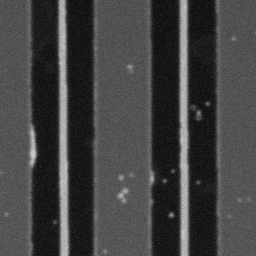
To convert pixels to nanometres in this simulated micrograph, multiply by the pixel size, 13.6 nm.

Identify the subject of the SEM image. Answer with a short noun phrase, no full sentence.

lines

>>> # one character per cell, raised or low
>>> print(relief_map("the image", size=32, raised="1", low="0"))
11110001000011111110000000011111
11110001000011111110000000011111
11110001000011111110000000011111
11110001000011111110000000011111
11110001000011111110000000011111
11110001000011111110000000011111
11110001000011111110000000011111
11110001000011111110000000011111
11110000000011111110000000011111
11110000000011111110000000011111
11110000000011111110000000011111
11110000000011111110000000011111
11110000000011111110000000011111
11110000000011111110000000011111
11110000000011111110000000011111
11110000000011111110000000011111
11110000000011111110000000011111
11110000000011111110000000011111
11110000000011111110000000011111
11110000000011111110000000011111
11110000000011111110000000011111
11110000000011111110000000011111
11110000000011111110000000011111
11110000000011111110000000011111
11110000000011111110000000011111
11110000000011111110000000011111
11110000000011111110000000011111
11110000000011111110000000011111
11110000000011111110000000011111
11110000000011111110000000011111
11110000000011111110000000011111
11110000000011111110000000011111